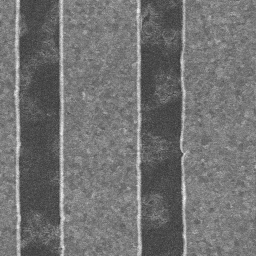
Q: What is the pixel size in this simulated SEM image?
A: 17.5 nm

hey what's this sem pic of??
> one or a few lines or trenches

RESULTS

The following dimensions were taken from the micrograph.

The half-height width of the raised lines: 1350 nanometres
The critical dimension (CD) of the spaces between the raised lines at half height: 784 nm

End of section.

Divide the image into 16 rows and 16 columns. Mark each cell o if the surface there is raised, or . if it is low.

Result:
o...ooooo...oooo
o...ooooo...oooo
o...ooooo...oooo
o...ooooo..ooooo
o...ooooo..ooooo
o...ooooo..ooooo
o...ooooo..ooooo
o...ooooo..ooooo
o...ooooo..ooooo
o...ooooo..ooooo
o...ooooo..ooooo
o...ooooo...oooo
o...ooooo...oooo
o...ooooo...oooo
o...ooooo...oooo
o...ooooo...oooo